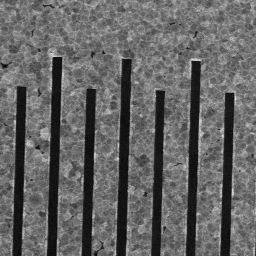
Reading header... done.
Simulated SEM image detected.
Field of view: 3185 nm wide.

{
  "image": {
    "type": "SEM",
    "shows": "parallel lines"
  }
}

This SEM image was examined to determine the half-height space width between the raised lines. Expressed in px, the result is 9.86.